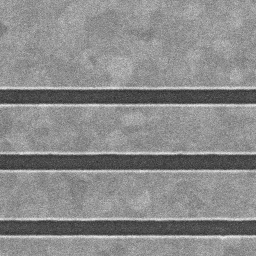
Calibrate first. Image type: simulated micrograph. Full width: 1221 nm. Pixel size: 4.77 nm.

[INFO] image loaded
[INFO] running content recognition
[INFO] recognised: one or a few lines or trenches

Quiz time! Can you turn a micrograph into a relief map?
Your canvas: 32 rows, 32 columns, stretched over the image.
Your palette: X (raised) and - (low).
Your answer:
XXXXXXXXXXXXXXXXXXXXXXXXXXXXXXXX
XXXXXXXXXXXXXXXXXXXXXXXXXXXXXXXX
XXXXXXXXXXXXXXXXXXXXXXXXXXXXXXXX
XXXXXXXXXXXXXXXXXXXXXXXXXXXXXXXX
XXXXXXXXXXXXXXXXXXXXXXXXXXXXXXXX
XXXXXXXXXXXXXXXXXXXXXXXXXXXXXXXX
XXXXXXXXXXXXXXXXXXXXXXXXXXXXXXXX
XXXXXXXXXXXXXXXXXXXXXXXXXXXXXXXX
XXXXXXXXXXXXXXXXXXXXXXXXXXXXXXXX
XXXXXXXXXXXXXXXXXXXXXXXXXXXXXXXX
XXXXXXXXXXXXXXXXXXXXXXXXXXXXXXXX
--------------------------------
--------------------------------
XXXXXXXXXXXXXXXXXXXXXXXXXXXXXXXX
XXXXXXXXXXXXXXXXXXXXXXXXXXXXXXXX
XXXXXXXXXXXXXXXXXXXXXXXXXXXXXXXX
XXXXXXXXXXXXXXXXXXXXXXXXXXXXXXXX
XXXXXXXXXXXXXXXXXXXXXXXXXXXXXXXX
XXXXXXXXXXXXXXXXXXXXXXXXXXXXXXXX
--------------------------------
--------------------------------
XXXXXXXXXXXXXXXXXXXXXXXXXXXXXXXX
XXXXXXXXXXXXXXXXXXXXXXXXXXXXXXXX
XXXXXXXXXXXXXXXXXXXXXXXXXXXXXXXX
XXXXXXXXXXXXXXXXXXXXXXXXXXXXXXXX
XXXXXXXXXXXXXXXXXXXXXXXXXXXXXXXX
XXXXXXXXXXXXXXXXXXXXXXXXXXXXXXXX
--------------------------------
--------------------------------
--------------------------------
XXXXXXXXXXXXXXXXXXXXXXXXXXXXXXXX
XXXXXXXXXXXXXXXXXXXXXXXXXXXXXXXX